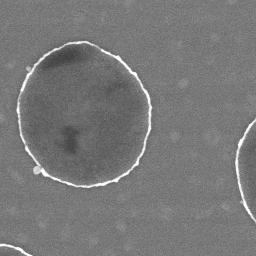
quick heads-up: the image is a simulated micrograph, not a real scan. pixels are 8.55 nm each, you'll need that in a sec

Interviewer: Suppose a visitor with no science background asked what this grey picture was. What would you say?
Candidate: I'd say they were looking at raised bodies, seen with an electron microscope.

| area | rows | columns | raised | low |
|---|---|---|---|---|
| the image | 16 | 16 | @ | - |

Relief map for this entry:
----------------
----------------
----------------
---@@@@---------
--@@@@@@--------
-@@@@@@@@-------
-@@@@@@@@-------
-@@@@@@@@-------
-@@@@@@@@------@
--@@@@@@@------@
--@@@@@@-------@
----@@@--------@
---------------@
----------------
----------------
@---------------